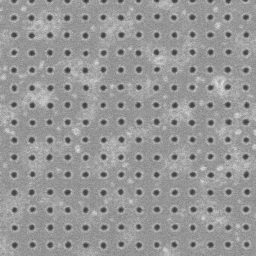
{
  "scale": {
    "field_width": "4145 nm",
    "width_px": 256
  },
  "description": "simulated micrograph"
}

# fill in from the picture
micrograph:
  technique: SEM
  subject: a regular array of holes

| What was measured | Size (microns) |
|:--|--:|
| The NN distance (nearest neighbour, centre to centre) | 0.278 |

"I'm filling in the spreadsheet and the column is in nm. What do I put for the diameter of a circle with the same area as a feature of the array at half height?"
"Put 111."